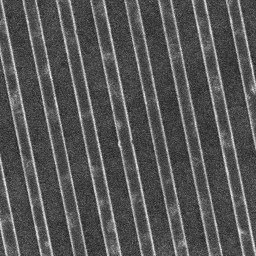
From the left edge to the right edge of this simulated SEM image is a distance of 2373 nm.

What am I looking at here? parallel lines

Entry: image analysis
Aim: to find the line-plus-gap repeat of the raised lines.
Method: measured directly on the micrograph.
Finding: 307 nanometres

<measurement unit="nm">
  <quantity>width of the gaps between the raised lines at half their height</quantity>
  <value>191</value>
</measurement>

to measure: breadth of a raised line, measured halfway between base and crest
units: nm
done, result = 119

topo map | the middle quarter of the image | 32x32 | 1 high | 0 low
00111000001110000001110000011100
00111000001110000001110000011100
00111000001111000001110000011110
00111000000111000001110000001110
00111100000111000001110000001110
00011100000111000000111000001110
00011100000111000000111000001110
00011100000111100000111000001111
00011100000011100000111000000111
00011110000011100000111000000111
00001110000011100000011100000111
00001110000011100000011100000111
00001110000011110000011100000111
00001110000001110000011100000011
00001111000001110000011100000011
00000111000001110000001110000011
00000111000001110000001110000011
00000111000001111000001110000011
00000111000000111000001110000001
00000111100000111000001110000001
00000011100000111000000111000001
00000011100000111000000111000001
10000011100000111100000111000001
10000011100000011100000111000000
10000011110000011100000111000000
10000001110000011100000011100000
10000001110000011100000011100000
11000001110000011110000011100000
11000001110000001110000011100000
11000001111000001110000011100000
11000000111000001110000001110000
11000000111000001110000001110000